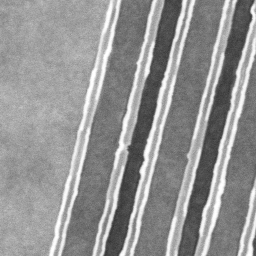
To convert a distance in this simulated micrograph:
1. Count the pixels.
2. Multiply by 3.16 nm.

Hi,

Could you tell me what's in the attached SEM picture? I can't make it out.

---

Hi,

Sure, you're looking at parallel lines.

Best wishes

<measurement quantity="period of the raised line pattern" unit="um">0.113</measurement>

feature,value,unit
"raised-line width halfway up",35.7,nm